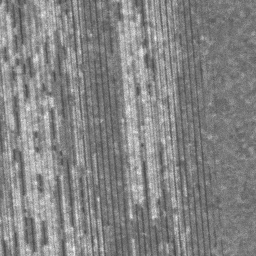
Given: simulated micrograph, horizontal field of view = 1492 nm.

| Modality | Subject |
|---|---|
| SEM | parallel lines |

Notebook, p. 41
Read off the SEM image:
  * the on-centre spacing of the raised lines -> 5.85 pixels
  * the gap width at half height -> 10.9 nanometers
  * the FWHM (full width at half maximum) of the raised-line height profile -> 22.5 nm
